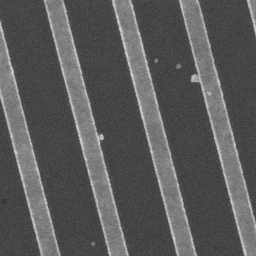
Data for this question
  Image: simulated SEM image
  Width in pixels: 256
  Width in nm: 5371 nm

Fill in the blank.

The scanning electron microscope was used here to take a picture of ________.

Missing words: lines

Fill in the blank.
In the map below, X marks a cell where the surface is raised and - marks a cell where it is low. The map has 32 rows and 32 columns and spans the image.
------XX------XX-------XX------X
------XX------XXX------XX------X
------XXX------XX------XX-------
------XXX------XX------XXX------
X------XX------XX-------XX------
X------XX------XXX------XX------
X------XXX------XX------XX------
X------XXX------XX------XXX-----
XX------XX------XXX------XX-----
XX------XX------XXX------XX-----
XX------XXX------XX------XX-----
XX-------XX------XX------XXX----
XXX------XX------XXX------XX----
XXX------XX------XXX------XX----
-XX------XXX------XX------XX----
-XX-------XX------XX------XXX---
-XXX------XX------XXX------XX---
-XXX------XX------XXX------XX---
--XX------XXX------XX------XXX--
--XX-------XX------XX------XXX--
--XXX------XX------XXX------XX--
--XXX------XX-------XX------XX--
---XX------XXX------XX------XXX-
---XX-------XX------XX------XXX-
---XXX------XX------XXX------XX-
---XXX------XX-------XX------XX-
----XX------XXX------XX------XXX
----XX-------XX------XX------XXX
----XXX------XX------XXX------XX
-----XX------XX-------XX------XX
-----XX------XXX------XX------XX
-----XX-------XX------XX-------X